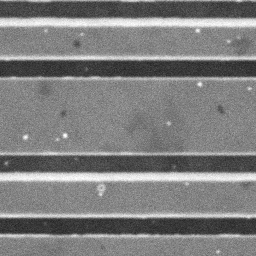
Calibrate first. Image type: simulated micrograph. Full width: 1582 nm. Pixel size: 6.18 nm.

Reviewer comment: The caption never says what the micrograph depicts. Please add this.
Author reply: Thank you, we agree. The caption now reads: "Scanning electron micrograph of lines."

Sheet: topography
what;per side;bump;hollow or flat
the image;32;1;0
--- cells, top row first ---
00000000000000000000000000000000
00000000000000000000000000000000
00000000000000000000000000000000
11111111111111111111111111111111
11111111111111111111111111111111
11111111111111111111111111111111
11111111111111111111111111111111
00000000000000000000000000000000
00000000000000000000000000000000
00000000000000000000000000000000
11111111111111111111111111111111
11111111111111111111111111111111
11111111111111111111111111111111
11111111111111111111111111111111
11111111111111111111111111111111
11111111111111111111111111111111
11111111111111111111111111111111
11111111111111111111111111111111
11111111111111111111111111111111
00000000000000000000000000000000
00000000000000000000000000000000
00000000000000000000000000000000
11111111111111111111111111111111
11111111111111111111111111111111
11111111111111111111111111111111
11111111111111111111111111111111
11111111111111111111111111111111
00000000000000000000000000000000
00000000000000000000000000000000
11111111111111111111111111111111
11111111111111111111111111111111
11111111111111111111111111111111